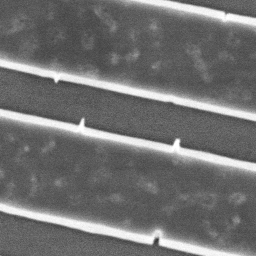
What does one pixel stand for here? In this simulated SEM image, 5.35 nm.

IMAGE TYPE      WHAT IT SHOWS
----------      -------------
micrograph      one or a few lines or trenches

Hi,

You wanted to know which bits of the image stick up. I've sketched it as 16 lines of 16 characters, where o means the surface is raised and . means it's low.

oooooooooooo....
oooooooooooooooo
oooooooooooooooo
oooooooooooooooo
..oooooooooooooo
.......ooooooooo
............oooo
oo..............
ooooooo.........
oooooooooooo....
oooooooooooooooo
oooooooooooooooo
oooooooooooooooo
..oooooooooooooo
.......ooooooooo
............oooo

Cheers